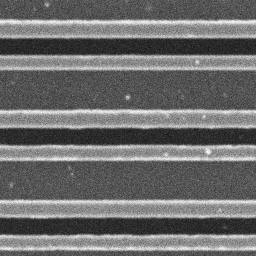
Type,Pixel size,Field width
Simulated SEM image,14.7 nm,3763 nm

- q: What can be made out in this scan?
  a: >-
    lines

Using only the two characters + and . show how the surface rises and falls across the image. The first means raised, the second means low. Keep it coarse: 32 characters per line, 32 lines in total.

................................
................................
................................
++++++++++++++++++++++++++++++++
++++++++++++++++++++++++++++++++
................................
................................
++++++++++++++++++++++++++++++++
++++++++++++++++++++++++++++++++
................................
................................
................................
................................
................................
++++++++++++++++++++++++++++++++
++++++++++++++++++++++++++++++++
................................
................................
++++++++++++++++++++++++++++++++
++++++++++++++++++++++++++++++++
................................
................................
................................
................................
................................
++++++++++++++++++++++++++++++++
++++++++++++++++++++++++++++++++
................................
................................
++...+.+.+++.++++..+++++++++++++
++++++++++++++++++++++++++++++++
................................